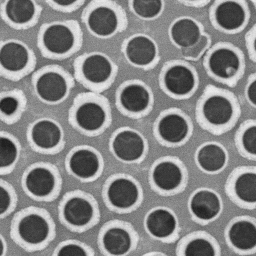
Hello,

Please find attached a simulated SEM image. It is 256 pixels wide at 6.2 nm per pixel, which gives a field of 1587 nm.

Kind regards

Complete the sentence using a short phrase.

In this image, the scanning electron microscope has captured a regular array of holes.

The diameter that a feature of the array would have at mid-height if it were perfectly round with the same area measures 0.195 micrometres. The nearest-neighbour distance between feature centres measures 0.295 um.